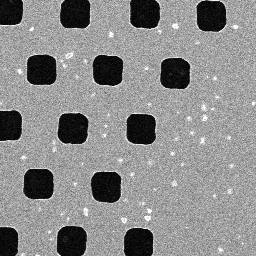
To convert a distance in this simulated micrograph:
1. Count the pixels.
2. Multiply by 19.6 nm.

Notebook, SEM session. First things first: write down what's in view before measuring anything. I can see holes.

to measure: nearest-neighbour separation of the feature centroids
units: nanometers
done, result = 1280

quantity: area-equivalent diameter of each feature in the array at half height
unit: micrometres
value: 0.641